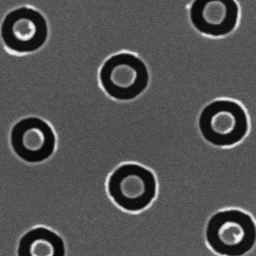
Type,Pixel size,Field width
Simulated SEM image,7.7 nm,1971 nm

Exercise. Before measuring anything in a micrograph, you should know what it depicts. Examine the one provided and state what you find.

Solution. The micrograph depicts ring-shaped grooves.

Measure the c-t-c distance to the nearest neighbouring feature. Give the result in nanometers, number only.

846